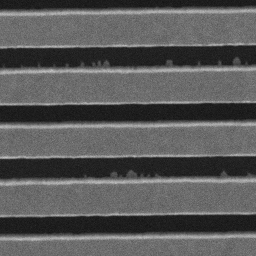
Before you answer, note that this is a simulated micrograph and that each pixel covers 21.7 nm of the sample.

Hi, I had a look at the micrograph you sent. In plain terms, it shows lines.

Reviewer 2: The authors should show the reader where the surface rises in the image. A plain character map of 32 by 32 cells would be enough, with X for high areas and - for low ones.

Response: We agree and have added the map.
--------------------------------
XXXXXXXXXXXXXXXXXXXXXXXXXXXXXXXX
XXXXXXXXXXXXXXXXXXXXXXXXXXXXXXXX
XXXXXXXXXXXXXXXXXXXXXXXXXXXXXXXX
XXXXXXXXXXXXXXXXXXXXXXXXXXXXXXXX
XXXXXXXXXXXXXXXXXXXXXXXXXXXXXXXX
--------------------------------
--------------------------------
-------------------XXXXXXXXXXXXX
XXXXXXXXXXXXXXXXXXXXXXXXXXXXXXXX
XXXXXXXXXXXXXXXXXXXXXXXXXXXXXXXX
XXXXXXXXXXXXXXXXXXXXXXXXXXXXXXXX
XXXXXXXXXXXXXXXXXXXXXXXXXXXXXXXX
--------------------------------
--------------------------------
-------XXXXXXXXXXXXXXXXXXXXXXXXX
XXXXXXXXXXXXXXXXXXXXXXXXXXXXXXXX
XXXXXXXXXXXXXXXXXXXXXXXXXXXXXXXX
XXXXXXXXXXXXXXXXXXXXXXXXXXXXXXXX
XXXXXXXXXXXXXXXXXXXXXXXXXXX-----
--------------------------------
--------------------------------
--------XXXXXXXXXXXXXXXXXXXXXXXX
XXXXXXXXXXXXXXXXXXXXXXXXXXXXXXXX
XXXXXXXXXXXXXXXXXXXXXXXXXXXXXXXX
XXXXXXXXXXXXXXXXXXXXXXXXXXXXXXXX
XXXXXXXXXXXXXXXXXXXXXXXXXXXXXXXX
--------------------------------
--------------------------------
-----XXXXXXXXXXXXXXXXXXXXXXXXXXX
XXXXXXXXXXXXXXXXXXXXXXXXXXXXXXXX
XXXXXXXXXXXXXXXXXXXXXXXXXXXXXXXX